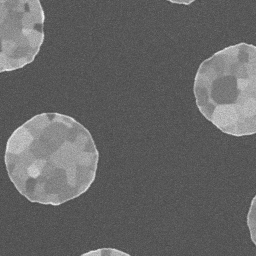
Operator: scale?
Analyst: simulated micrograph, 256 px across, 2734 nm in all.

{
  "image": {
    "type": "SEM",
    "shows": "raised bodies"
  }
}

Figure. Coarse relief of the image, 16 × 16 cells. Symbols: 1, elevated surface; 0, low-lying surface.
1110000000000000
1110000000000000
1110000000000000
1100000000000111
0000000000001111
0000000000001111
0000000000001111
0011100000000111
0111110000000000
1111110000000000
1111110000000000
0111110000000000
0011000000000000
0000000000000000
0000000000000000
0000000000000000